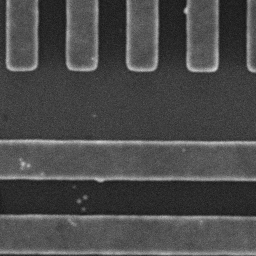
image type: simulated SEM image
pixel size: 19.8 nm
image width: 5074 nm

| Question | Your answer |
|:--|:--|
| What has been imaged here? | groups of lines, slits or small figures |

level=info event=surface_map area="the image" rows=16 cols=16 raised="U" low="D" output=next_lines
UUDDUUDDUUDDUUDU
UUDDUUDDUUDDUUDU
UUDDUUDDUUDDUUDU
UUDDUUDDUUDDUUDU
DDDDDDDDDDDDDDDD
DDDDDDDDDDDDDDDD
DDDDDDDDDDDDDDDD
DDDDDDDDDDDDDDDD
DDDDDDDDDDDDDDDD
UUUUUUUUUUUUUUUU
UUUUUUUUUUUUUUUU
DDDDDDDDDDDDDDDD
DDDDDDDDDDDDDDDD
UUUUUUUUUDDDDDDD
UUUUUUUUUUUUUUUU
UUUUUUUUUUUUUUUU